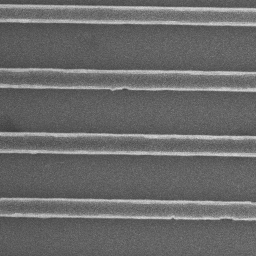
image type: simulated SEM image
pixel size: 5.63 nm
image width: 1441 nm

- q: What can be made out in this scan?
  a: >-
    one or a few lines or trenches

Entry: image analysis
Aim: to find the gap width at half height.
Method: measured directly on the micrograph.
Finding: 262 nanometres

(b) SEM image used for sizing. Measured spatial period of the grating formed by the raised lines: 364 nanometres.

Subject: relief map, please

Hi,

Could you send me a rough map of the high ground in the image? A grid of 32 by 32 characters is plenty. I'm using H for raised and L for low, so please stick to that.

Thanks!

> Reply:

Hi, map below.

LLLLLLLLLLLLLLLLLLLLLLLLLLLLLLLL
HHHHHHHHHHHHHHHHHHHHHHHHHHHHHHHH
HHHHHHHHHHHHHHHHHHHHHHHHHHHHHHHH
LLLLLLLLLLLLLLLLLLLLLLLLLLLLLLLL
LLLLLLLLLLLLLLLLLLLLLLLLLLLLLLLL
LLLLLLLLLLLLLLLLLLLLLLLLLLLLLLLL
LLLLLLLLLLLLLLLLLLLLLLLLLLLLLLLL
LLLLLLLLLLLLLLLLLLLLLLLLLLLLLLLL
LLLLLLLLLLLLLLLLLLLLLLLLLLLLLLLL
HHHHHHHHHHHHHHHHHHHHHHHHHHHHHHHH
HHHHHHHHHHHHHHHHHHHHHHHHHHHHHHHH
LLLLLLLLLLLLLLLLLLLLLLLLLLLLLLLL
LLLLLLLLLLLLLLLLLLLLLLLLLLLLLLLL
LLLLLLLLLLLLLLLLLLLLLLLLLLLLLLLL
LLLLLLLLLLLLLLLLLLLLLLLLLLLLLLLL
LLLLLLLLLLLLLLLLLLLLLLLLLLLLLLLL
LLLLLLLLLLLLLLLLLLLLLLLLLLLLLLLL
HHHHHHHHHHHHHHHHHHHHHHHHHHHHHHHH
HHHHHHHHHHHHHHHHHHHHHHHHHHHHHHHH
LLLLLLLLLLLLLLLLLLLLLLLLLLLLLHLL
LLLLLLLLLLLLLLLLLLLLLLLLLLLLLLLL
LLLLLLLLLLLLLLLLLLLLLLLLLLLLLLLL
LLLLLLLLLLLLLLLLLLLLLLLLLLLLLLLL
LLLLLLLLLLLLLLLLLLLLLLLLLLLLLLLL
LLLLLLLLLLLLLLLLLLLLLLLLLLLLLLLL
HHHHHHHHHHHHHHHHHHHHHHHHHHHHHHHH
HHHHHHHHHHHHHHHHHHHHHHHHHHHHHHHH
LLLLLLLLLLLLLLLLLLLLLLLLLLLLLLLL
LLLLLLLLLLLLLLLLLLLLLLLLLLLLLLLL
LLLLLLLLLLLLLLLLLLLLLLLLLLLLLLLL
LLLLLLLLLLLLLLLLLLLLLLLLLLLLLLLL
LLLLLLLLLLLLLLLLLLLLLLLLLLLLLLLL